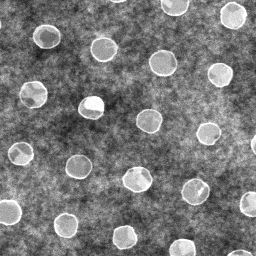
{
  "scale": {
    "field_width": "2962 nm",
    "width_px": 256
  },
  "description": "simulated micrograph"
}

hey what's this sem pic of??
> a regular array of raised bodies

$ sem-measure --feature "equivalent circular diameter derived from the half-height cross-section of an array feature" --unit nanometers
284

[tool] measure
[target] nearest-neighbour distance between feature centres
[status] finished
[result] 685 nanometers